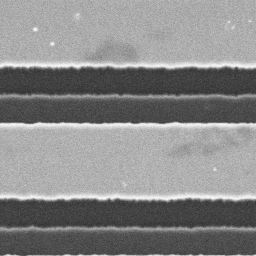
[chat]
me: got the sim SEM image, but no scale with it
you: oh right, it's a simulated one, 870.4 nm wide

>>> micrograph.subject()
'lines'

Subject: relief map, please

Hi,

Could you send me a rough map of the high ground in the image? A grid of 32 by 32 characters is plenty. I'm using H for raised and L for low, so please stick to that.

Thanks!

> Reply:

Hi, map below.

HHHHHHHHHHHHHHHHHHHHHHHHHHHHHHHH
HHHHHHHHHHHHHHHHHHHHHHHHHHHHHHHH
HHHHHHHHHHHHHHHHHHHHHHHHHHHHHHHH
HHHHHHHHHHHHHHHHHHHHHHHHHHHHHHHH
HHHHHHHHHHHHHHHHHHHHHHHHHHHHHHHH
HHHHHHHHHHHHHHHHHHHHHHHHHHHHHHHH
HHHHHHHHHHHHHHHHHHHHHHHHHHHHHHHH
HHHHHHHHHHHHHHHHHHHHHHHHHHHHHHHH
LLLLLLLLLLLLLLLLLLLLLLLLLLLLLLLL
LLLLLLLLLLLLLLLLLLLLLLLLLLLLLLLL
LLLLLLLLLLLLLLLLLLLLLLLLLLLLLLLL
LLLLLLLLLLLLLLLLLLLLLLLLLLLLLLLL
LLLLLLLLLLLLLLLLLLLLLLLLLLLLLLLL
LLLLLLLLLLLLLLLLLLLLLLLLLLLLLLLL
LLLLLLLLLLLLLLLLLLLLLLLLLLLLLLLL
HHHLHHHHHHHHHHHHHHHHHHHHHHHHHHHH
HHHHHHHHHHHHHHHHHHHHHHHHHHHHHHHH
HHHHHHHHHHHHHHHHHHHHHHHHHHHHHHHH
HHHHHHHHHHHHHHHHHHHHHHHHHHHHHHHH
HHHHHHHHHHHHHHHHHHHHHHHHHHHHHHHH
HHHHHHHHHHHHHHHHHHHHHHHHHHHHHHHH
HHHHHHHHHHHHHHHHHHHHHHHHHHHHHHHH
HHHHHHHHHHHHHHHHHHHHHHHHHHHHHHHH
HHHHHHHHHHHHHHHHHHHHHHHHHHHHHHHH
HHHHHHHHHHHHHHHHHHHHHHHHHHHHHHHH
LLLLLLLLLLLLLLLLLLLLLLLLLLLLLLLL
LLLLLLLLLLLLLLLLLLLLLLLLLLLLLLLL
LLLLLLLLLLLLLLLLLLLLLLLLLLLLLLLL
LLLLLLLLLLLLLLLLLLLLLLLLLLLLLLLL
LLLLLLLLLLLLLLLLLLLLLLLLLLLLLLLL
LLLLLLLLLLLLLLLLLLLLLLLLLLLLLLLL
LLLLLLLLLLLLLLLLLLLLLLLLLLLLLLLL